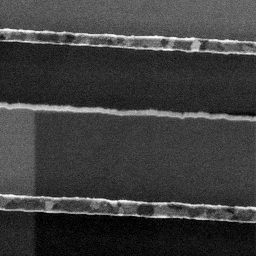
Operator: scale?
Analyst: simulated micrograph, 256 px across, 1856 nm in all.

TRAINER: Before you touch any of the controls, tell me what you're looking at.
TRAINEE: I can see lines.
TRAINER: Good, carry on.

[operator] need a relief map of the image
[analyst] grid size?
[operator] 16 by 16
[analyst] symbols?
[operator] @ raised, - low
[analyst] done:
@@@@@@@@@@@@@@@@
@@@@@@@@@@@@@@@@
@@@@@@@@@@@@@@@@
----------------
----------------
----------------
----------------
@@@@@@@@@@@@@@@@
@@@@@@@@@@@@@@@@
@@@@@@@@@@@@@@@@
@@@@@@@@@@@@@@@@
@@@@@@@@@@@@@@@@
@@@@@@@@@@@@@@@@
--------@@@@@@@@
----------------
----------------